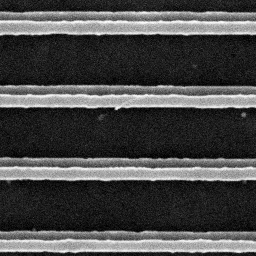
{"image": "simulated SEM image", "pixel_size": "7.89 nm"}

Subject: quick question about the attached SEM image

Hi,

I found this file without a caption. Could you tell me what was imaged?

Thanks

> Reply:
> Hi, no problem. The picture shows lines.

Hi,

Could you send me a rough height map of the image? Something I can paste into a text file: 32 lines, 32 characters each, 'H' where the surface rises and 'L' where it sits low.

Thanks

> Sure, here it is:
LLLLLLLLLLLLLLLLLLLLLLLLLLLLLLLL
LLLLLLLLLLLLLLLLLLLLLLLLLLLLLLLL
HHHHHHHHHHHHHHHHHHHHHHHHHHHHHHHH
HHHHHHHHHHHHHHHHHHHHHHHHHHHHHHHH
LLLLLLLLLLLLLLLLLLLLLLLLLLLLLLLL
LLLLLLLLLLLLLLLLLLLLLLLLLLLLLLLL
LLLLLLLLLLLLLLLLLLLLLLLLLLLLLLLL
LLLLLLLLLLLLLLLLLLLLLLLLLLLLLLLL
LLLLLLLLLLLLLLLLLLLLLLLLLLLLLLLL
LLLLLLLLLLLLLLLLLLLLLLLLLLLLLLLL
LLLLLLLLLLLLLLLLLLLLLLLLLLLLLLLL
HHHHHHHHHHHHHHHHHHHHHHHHHHHHHHHH
HHHHHHHHHHHHHHHHHHHHHHHHHHHHHHHH
LLLLLLLLLLLLLLLLLLLLLLLLLLLLLLLL
LLLLLLLLLLLLLLLLLLLLLLLLLLLLLLLL
LLLLLLLLLLLLLLLLLLLLLLLLLLLLLLLL
LLLLLLLLLLLLLLLLLLLLLLLLLLLLLLLL
LLLLLLLLLLLLLLLLLLLLLLLLLLLLLLLL
LLLLLLLLLLLLLLLLLLLLLLLLLLLLLLLL
LLLLLLLLLLLLLLLLLLLLLLLLLLLLLLLL
HHHHHHHHHHHHHHHHHHHHHHHHHHHHHHHH
HHHHHHHHHHHHHHHHHHHHHHHHHHHHHHHH
LLLLLLLLHHLLHHLLLLLHLLLLHHHHHHLL
LLLLLLLLLLLLLLLLLLLLLLLLLLLLLLLL
LLLLLLLLLLLLLLLLLLLLLLLLLLLLLLLL
LLLLLLLLLLLLLLLLLLLLLLLLLLLLLLLL
LLLLLLLLLLLLLLLLLLLLLLLLLLLLLLLL
LLLLLLLLLLLLLLLLLLLLLLLLLLLLLLLL
LLLLLLLLLLLLLLLLLLLLLLLLLLLLLLLL
HHHHHHHHHHHHHHHHHHHHHHHHHHHHHHHH
HHHHHHHHHHHHHHHHHHHHHHHHHHHHHHHH
LLLLLLLHHHLLLLLLLLLLLLLHHHLLLHHL